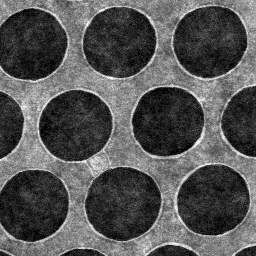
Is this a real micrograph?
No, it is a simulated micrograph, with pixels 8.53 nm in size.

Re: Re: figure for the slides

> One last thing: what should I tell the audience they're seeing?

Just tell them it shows holes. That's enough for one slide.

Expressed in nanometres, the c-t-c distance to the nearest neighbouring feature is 769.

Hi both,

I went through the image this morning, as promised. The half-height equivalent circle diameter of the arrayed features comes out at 624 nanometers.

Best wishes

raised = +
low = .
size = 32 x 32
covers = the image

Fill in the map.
++++++++++++++++++++++++++++++++
++....++++++......++++++.....+++
+......++++........+++........++
........+++........+++.........+
........++..........++.........+
.........+..........++.........+
........++.........+++.........+
........+++........+++........++
.......+++++......+++++......+++
+.....+++++++....+++++++....++++
++++++++++++++++++++++++++++++++
++++++++....++++++......++++++..
..++++.......++++........++++...
...++.........+++........+++....
...++.........+++.........++....
...++.........++..........++....
...++.........+++........+++....
...++.........+++........+++....
..++++.......+++++......+++++...
.++++++......++++++...+++++++++.
+++++++++++...++++++++++++.+++++
+++...++++++......++++++......++
+.......++++.......++++........+
........+++.........++.........+
.........++.........++.........+
.........++.........++.........+
.........++.........++.........+
........+++.........+++.......++
........++++.......+++++.....+++
+.....+++++++.....++++++++++++++
++++++++++++++++++++++++++++++++
.+++++++....+++++++.....++++++..